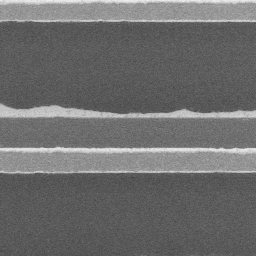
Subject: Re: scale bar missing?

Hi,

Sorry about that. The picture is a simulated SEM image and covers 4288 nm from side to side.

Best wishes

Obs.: lines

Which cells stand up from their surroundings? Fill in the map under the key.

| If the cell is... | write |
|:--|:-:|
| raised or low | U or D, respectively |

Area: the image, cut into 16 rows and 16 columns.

UUUUUUUUUUUUUUUU
DDDDDDDDDDDDDDDD
DDDDDDDDDDDDDDDD
DDDDDDDDDDDDDDDD
DDDDDDDDDDDDDDDD
DDDDDDDDDDDDDDDD
DDDDDDDDDDDDDDDD
UUUUUUUUUUUUUUUU
UUUUUUUUUUUUUUUU
UUUUUUUUUUUUUUUU
UUUUUUUUUUUUUUUU
DDDDDDDDDDDDDDDD
DDDDDDDDDDDDDDDD
DDDDDDDDDDDDDDDD
DDDDDDDDDDDDDDDD
DDDDDDDDDDDDDDDD